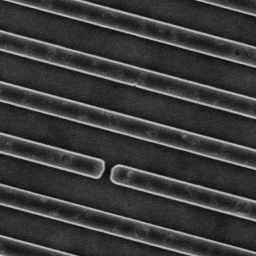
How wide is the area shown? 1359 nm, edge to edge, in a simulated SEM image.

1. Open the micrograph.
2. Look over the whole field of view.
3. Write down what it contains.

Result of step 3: parallel lines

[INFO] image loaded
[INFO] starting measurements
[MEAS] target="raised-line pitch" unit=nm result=263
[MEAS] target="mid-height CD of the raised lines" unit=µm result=0.1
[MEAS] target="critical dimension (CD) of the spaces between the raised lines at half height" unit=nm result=160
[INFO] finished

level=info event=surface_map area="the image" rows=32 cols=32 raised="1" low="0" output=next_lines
00111111111100000000000000111111
00000011111111100000000000000011
00000000001111111110000000000000
00000000000001111111111000000000
11100000000000000111111111100000
11111100000000000000011111111100
01111111110000000000000001111111
00000111111111000000000000000111
00000000111111111000000000000000
00000000000011111111100000000000
10000000000000001111111110000000
11111000000000000000111111111000
11111111100000000000000111111111
00011111111100000000000000011111
00000001111111110000000000000001
00000000000111111111000000000000
00000000000000011111111100000000
11100000000000000011111111100000
11111110000000000000001111111110
00111111111000000000000000111111
00000011111110000000000000000011
00000000011110111100000000000000
00000000000000111111110000000000
11000000000000000111111111000000
11111000000000000000111111111000
11111111100000000000000011111111
00001111111110000000000000001111
00000000111111111000000000000000
00000000000111111111000000000000
00000000000000011111111100000000
11110000000000000001111111110000
11111111000000000000001111111111